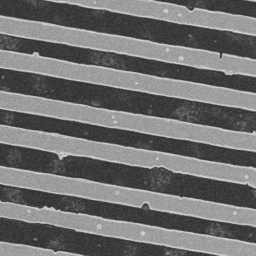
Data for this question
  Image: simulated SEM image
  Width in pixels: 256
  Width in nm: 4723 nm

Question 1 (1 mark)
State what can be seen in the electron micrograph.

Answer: parallel lines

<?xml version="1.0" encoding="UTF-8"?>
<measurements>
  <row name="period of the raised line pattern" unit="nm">678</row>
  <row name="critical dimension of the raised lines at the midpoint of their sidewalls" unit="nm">312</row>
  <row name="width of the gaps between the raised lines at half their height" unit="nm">404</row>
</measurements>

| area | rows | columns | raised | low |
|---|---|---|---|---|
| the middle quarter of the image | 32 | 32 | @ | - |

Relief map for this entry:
@@@@@@@------------------------@
@@@@@@@@@@@@@-------------------
@@@@@@@@@@@@@@@@@@@-------------
@@@@@@@@@@@@@@@@@@@@@@@@--------
------@@@@@@@@@@@@@@@@@@@@@@@@@@
------------@@@@@@@@@@@@@@@@@@@@
-----------------@@@@@@@@@@@@@@@
----------------------@@@@@@@@@@
------------------------------@@
--------------------------------
@@@@@---------------------------
@@@@@@@@@@@---------------------
@@@@@@@@@@@@@@@@@---------------
@@@@@@@@@@@@@@@@@@@@@@@---------
-----@@@@@@@@@@@@@@@@@@@@@@@@@--
---------@@@@@@@@@@@@@@@@@@@@@@@
----------------@@@@@@@@@@@@@@@@
---------------------@@@@@@@@@@@
@@-------------------------@@@@@
@@@@@@@@------------------------
@@@@@@@@@@@@@@------------------
@@@@@@@@@@@@@@@@@@@@------------
@@@@@@@@@@@@@@@@@@@@@@@@@@@-----
--------@@@@@@@@@@@@@@@@@@@@@@@@
-------------@@@@@@@@@@@@@@@@@@@
-------------------@@@@@@@@@@@@@
--------------------------@@@@@@
-------------------------------@
@-------------------------------
@@@@@@@@------------------------
@@@@@@@@@@@@@-------------------
@@@@@@@@@@@@@@@@@@--------------